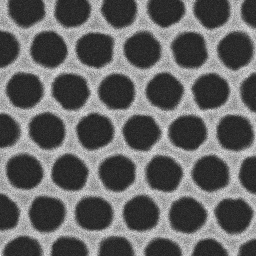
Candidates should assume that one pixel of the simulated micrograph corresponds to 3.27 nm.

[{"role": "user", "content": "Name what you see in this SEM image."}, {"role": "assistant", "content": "a regular array of holes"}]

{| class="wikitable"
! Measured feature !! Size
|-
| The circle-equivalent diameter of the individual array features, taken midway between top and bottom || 118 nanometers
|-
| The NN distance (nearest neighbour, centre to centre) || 151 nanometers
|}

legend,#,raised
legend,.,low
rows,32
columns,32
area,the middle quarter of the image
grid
######....########....#######...
################################
..##########..##########...#####
.....#####......######......####
......####.......####........###
......###.........###.........##
......##..........##..........##
.......##.........##..........##
......###........####........###
.....#####.......#####.......###
.....######.....#######.....####
#..######################..#####
######...#######################
#####......######.....######....
####.......#####.......####.....
###.........###........###......
###..........##.........##......
###.........###.........##......
####........###.........##......
####.......####........####.....
#####.....######......######....
##################...##########.
#.##############################
...########.....######.....#####
.....#####.......####.......####
.....####.........###........###
......###.........###.........##
......###.........###.........##
......###.........###........###
.....#####.......####........###
.....#####......#####........###
#...#######....#########....####